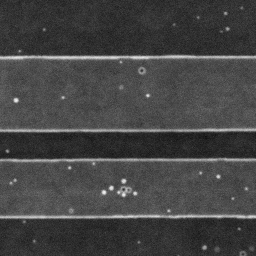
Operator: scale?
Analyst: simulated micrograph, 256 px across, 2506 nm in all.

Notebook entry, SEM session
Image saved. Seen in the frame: lines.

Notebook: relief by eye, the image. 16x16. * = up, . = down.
................
................
................
................
****************
****************
****************
****************
................
................
****************
****************
****************
****************
................
................